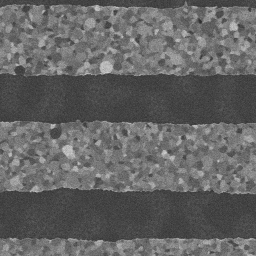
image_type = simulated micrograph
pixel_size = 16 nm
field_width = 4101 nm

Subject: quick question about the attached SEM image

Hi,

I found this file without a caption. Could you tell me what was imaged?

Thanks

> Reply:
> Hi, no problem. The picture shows one or a few lines or trenches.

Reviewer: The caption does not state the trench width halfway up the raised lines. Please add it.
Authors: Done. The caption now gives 777 nm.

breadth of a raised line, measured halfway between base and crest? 67.5 pixels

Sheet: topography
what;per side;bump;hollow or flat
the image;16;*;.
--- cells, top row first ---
****************
****************
****************
****************
****************
................
................
................
****************
****************
****************
****************
................
................
................
****************